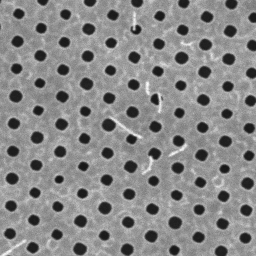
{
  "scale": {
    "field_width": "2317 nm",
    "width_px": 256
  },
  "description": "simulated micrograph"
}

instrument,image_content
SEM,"a regular array of holes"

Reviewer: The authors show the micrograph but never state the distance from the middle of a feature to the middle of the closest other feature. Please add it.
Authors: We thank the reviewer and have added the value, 26.9 pixels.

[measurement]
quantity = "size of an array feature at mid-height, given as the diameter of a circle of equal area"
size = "110 nm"